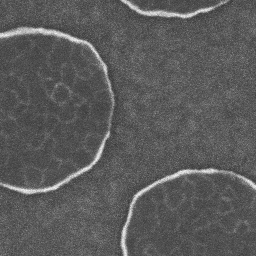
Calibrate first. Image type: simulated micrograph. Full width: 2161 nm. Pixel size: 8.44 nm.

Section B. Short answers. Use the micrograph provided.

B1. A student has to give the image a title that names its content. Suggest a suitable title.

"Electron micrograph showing raised bodies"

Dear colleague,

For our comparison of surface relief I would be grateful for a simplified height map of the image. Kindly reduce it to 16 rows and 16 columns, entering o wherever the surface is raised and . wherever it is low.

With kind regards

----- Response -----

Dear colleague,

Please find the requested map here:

........ooooo...
................
ooooo...........
oooooo..........
ooooooo.........
ooooooo.........
ooooooo.........
ooooooo.........
ooooooo.........
oooooo..........
ooooo...........
oooo......oooooo
........oooooooo
........oooooooo
........oooooooo
........oooooooo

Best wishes